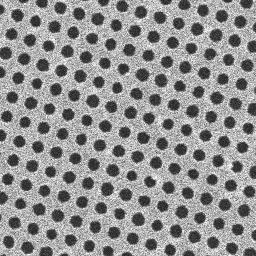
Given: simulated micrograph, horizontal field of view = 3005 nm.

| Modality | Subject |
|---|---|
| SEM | a regular array of holes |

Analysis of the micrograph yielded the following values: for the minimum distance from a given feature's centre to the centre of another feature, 19.4 px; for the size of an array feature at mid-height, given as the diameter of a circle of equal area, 142 nm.